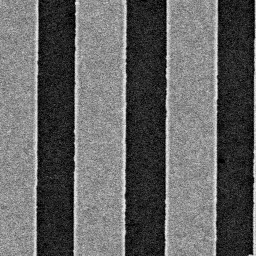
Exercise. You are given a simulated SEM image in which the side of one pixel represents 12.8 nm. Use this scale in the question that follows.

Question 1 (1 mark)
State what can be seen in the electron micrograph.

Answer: lines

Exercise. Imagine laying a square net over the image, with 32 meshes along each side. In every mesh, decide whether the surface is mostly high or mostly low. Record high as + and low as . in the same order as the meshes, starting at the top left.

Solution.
+++++.....++++++.....++++++.....
+++++.....++++++.....++++++.....
+++++.....++++++.....++++++.....
+++++.....++++++.....++++++.....
+++++.....++++++.....++++++.....
+++++.....++++++.....++++++.....
+++++.....++++++.....++++++.....
+++++.....++++++.....++++++.....
+++++.....++++++.....++++++.....
+++++.....++++++.....++++++.....
+++++.....++++++.....++++++.....
+++++....+++++++.....++++++.....
+++++....+++++++.....++++++.....
+++++....+++++++.....++++++.....
+++++....+++++++.....++++++.....
+++++....+++++++.....++++++.....
+++++....+++++++.....++++++.....
+++++....+++++++.....++++++.....
+++++....+++++++.....++++++.....
+++++....+++++++.....++++++.....
+++++....+++++++.....++++++.....
+++++....+++++++.....++++++.....
+++++....+++++++.....++++++.....
++++.....+++++++.....++++++.....
++++.....+++++++.....++++++.....
++++.....+++++++.....++++++.....
++++.....+++++++.....++++++.....
++++.....+++++++.....++++++.....
++++.....+++++++.....++++++.....
++++.....+++++++.....++++++.....
++++.....+++++++.....++++++.....
++++.....+++++++.....++++++.....